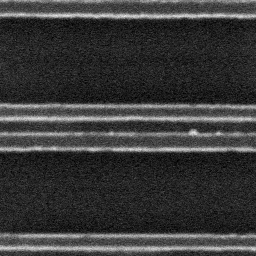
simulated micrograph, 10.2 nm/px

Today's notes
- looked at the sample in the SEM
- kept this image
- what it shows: lines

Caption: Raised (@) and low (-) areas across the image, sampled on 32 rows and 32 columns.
@@@@@@@@@@@@@@@@@@@@@@@@@@@@@@@@
@@@@@@@@@@@@@@@@@@@@@@@@@@@@@@@@
--------------------------------
--------------------------------
--------------------------------
--------------------------------
--------------------------------
--------------------------------
--------------------------------
--------------------------------
--------------------------------
--------------------------------
--------------------------------
@@@@@@@@@@@@@@@@@@@@@@@@@@@@@@@@
@@@@@@@@@@@@@@@@@@@@@@@@@@@@@@@@
@@@@@@@@@@@@@@@@@@@@@@@@@@@@@@@@
@@@@@@@@@@@@@@@@@@@@@@@@@@@@@@@@
@@@@@@@@@@@@@@@@@@@@@@@@@@@@@@@@
@@@@@@@@@@@@@@@@@@@@@@@@@@@@@@@@
--------------------------------
--------------------------------
--------------------------------
--------------------------------
--------------------------------
--------------------------------
--------------------------------
--------------------------------
--------------------------------
--------------------------------
@@@@@@@@@@@@--@--@@@@-----------
@@@@@@@@@@@@@@@@@@@@@@@@@@@@@@@@
@@@@@@@@@@@@@@@@@@@@@@@@@@@@@@@@